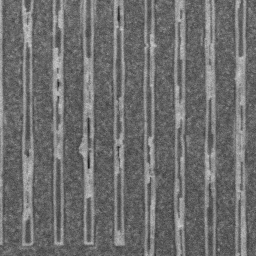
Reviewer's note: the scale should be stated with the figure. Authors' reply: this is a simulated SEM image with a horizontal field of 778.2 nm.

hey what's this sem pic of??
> parallel lines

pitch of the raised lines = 92.4 nanometres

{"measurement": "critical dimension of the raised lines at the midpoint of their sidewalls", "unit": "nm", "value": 23.2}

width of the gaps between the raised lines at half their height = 68.8 nm